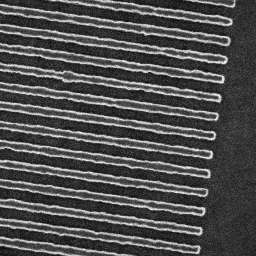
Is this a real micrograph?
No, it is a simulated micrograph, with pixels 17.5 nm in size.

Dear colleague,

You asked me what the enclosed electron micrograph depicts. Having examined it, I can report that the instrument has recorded parallel lines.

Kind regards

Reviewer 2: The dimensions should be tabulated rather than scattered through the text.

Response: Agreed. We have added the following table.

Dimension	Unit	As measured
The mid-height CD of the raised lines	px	6.8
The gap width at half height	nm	220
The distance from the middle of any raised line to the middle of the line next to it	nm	335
